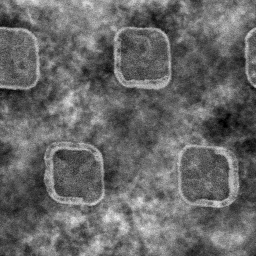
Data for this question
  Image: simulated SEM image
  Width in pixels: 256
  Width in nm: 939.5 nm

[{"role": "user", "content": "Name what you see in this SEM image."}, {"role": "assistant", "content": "raised bodies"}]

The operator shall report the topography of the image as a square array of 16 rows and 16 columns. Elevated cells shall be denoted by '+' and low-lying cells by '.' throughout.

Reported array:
................
................
++.....+++.....+
++.....++++....+
++.....++++....+
.........+......
................
................
................
...+++.....+++..
...+++.....++++.
...+++.....++++.
....++......+++.
................
................
................